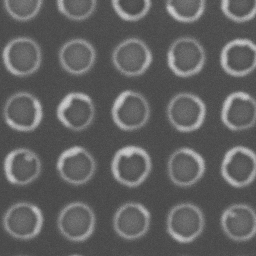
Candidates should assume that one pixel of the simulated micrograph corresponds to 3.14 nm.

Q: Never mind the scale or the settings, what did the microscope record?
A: a regular array of holes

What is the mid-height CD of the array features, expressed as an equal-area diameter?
93.9 nanometers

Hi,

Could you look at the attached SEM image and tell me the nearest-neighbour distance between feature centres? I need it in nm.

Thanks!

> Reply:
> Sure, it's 169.